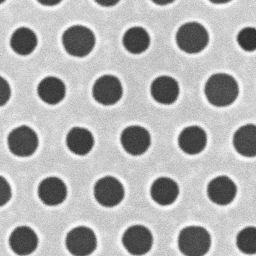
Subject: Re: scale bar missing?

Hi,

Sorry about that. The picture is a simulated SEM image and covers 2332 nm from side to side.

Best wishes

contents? a regular array of holes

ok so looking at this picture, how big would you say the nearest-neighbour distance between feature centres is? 510 nm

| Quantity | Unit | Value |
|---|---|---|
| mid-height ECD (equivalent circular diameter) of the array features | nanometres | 287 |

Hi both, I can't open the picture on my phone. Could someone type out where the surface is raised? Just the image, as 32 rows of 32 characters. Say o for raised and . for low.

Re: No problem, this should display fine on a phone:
ooooo..ooooo...oooo..oooooo.oooo
oooooooooooooooooooooooooooooooo
oooooooooooooooooooooooooooooooo
oo..oooo...ooooo..oooo....oooo..
o....ooo....ooo....ooo....oooo..
o....ooo....ooo....ooo....oooo..
oo..oooo...ooooo..ooooo..ooooooo
oooooooooooooooooooooooooooooooo
oooooooooooooooooooooooooooooooo
oooooo.oooooo..ooooo.ooooo...ooo
.oooo...oooo...oooo...oooo....oo
.oooo...ooo....oooo...ooo.....oo
.oooo...oooo...oooo...oooo....oo
ooooooooooooooooooooooooooo.oooo
oooooooooooooooooooooooooooooooo
ooooooooooooooooooooooooooooooo.
o....ooo...oooo....ooo....ooo...
o....ooo....ooo....ooo....ooo...
o....ooo....ooo....ooo....ooo...
oo..oooooooooooooooooooooooooo..
oooooooooooooooooooooooooooooooo
oooooooooooooooooooooooooooooooo
.oooo...oooo...oooo...oooo...ooo
.oooo...oooo....ooo...oooo....oo
..ooo...oooo....ooo...oooo....oo
.oooo...oooo...ooooo..ooooo..ooo
oooooooooooooooooooooooooooooooo
oooooooooooooooooooooooooooooooo
oo..ooooo..ooooo..ooooo...oooo..
o....ooo....ooo....ooo....oooo..
o....ooo....ooo....ooo....ooo...
oo..ooooo...oooo...oooo...oooo..